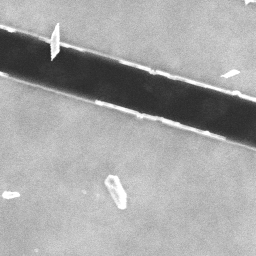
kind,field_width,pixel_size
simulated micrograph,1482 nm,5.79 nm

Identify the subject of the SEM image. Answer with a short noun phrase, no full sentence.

one or a few lines or trenches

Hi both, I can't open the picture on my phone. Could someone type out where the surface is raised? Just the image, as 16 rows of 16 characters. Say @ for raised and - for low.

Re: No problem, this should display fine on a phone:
----------------
----------------
@@@@------------
@@@@@@@---------
@@@@@@@@@@------
---@@@@@@@@@@@--
------@@@@@@@@@@
----------@@@@@@
-------------@@@
----------------
----------------
----------------
----------------
----------------
----------------
----------------